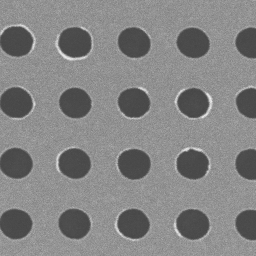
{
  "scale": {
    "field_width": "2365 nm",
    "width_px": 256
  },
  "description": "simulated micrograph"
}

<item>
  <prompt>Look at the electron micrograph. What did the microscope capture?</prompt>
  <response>a regular array of holes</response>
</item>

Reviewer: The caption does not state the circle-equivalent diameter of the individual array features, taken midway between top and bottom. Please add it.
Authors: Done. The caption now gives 31.8 px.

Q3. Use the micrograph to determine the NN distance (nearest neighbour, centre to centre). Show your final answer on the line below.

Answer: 544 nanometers